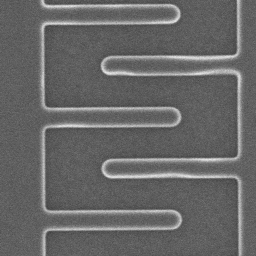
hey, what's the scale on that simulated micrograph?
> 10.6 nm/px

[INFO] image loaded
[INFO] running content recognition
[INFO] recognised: groups of lines, slits or small figures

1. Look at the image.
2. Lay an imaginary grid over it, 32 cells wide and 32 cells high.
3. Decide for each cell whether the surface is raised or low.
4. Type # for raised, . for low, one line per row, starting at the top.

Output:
######........................##
######################........##
######################........##
#####.........................##
#####.........................##
#####.........................##
#####.........................##
#####........###################
#####........###################
#####.........................##
#####.........................##
#####.........................##
#####.........................##
######........................##
######################........##
######################........##
######........................##
#####.........................##
#####.........................##
#####.........................##
#####........###################
#####........###################
######........................##
######........................##
######........................##
######........................##
######################........##
#######################.......##
######################........##
######........................##
######........................##
######........................##